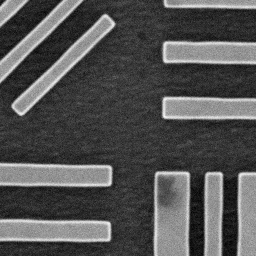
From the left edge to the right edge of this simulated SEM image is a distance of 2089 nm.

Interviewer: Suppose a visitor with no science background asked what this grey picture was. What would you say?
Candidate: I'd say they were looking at groups of lines, slits or small figures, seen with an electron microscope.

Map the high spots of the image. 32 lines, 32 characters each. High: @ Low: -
@@@----@@@-----------@@@@@@@@@@@
@@----@@@-----------------------
@----@@@----@@------------------
----@@@----@@@------------------
---@@@----@@@-------------------
--@@@----@@@---------@@@@@@@@@@@
-@@@----@@@---------@@@@@@@@@@@@
@@@----@@@-----------@@@@@@@@@@@
@@----@@@-----------------------
@----@@@------------------------
----@@@-------------------------
---@@@--------------------------
--@@@---------------@@@@@@@@@@@@
--@@----------------@@@@@@@@@@@@
--------------------@@@@@@@@@@@@
--------------------------------
--------------------------------
--------------------------------
--------------------------------
--------------------------------
--------------------------------
@@@@@@@@@@@@@@------------------
@@@@@@@@@@@@@@-----@@@@@--@@--@@
-------------------@@@@@--@@--@@
-------------------@@@@@--@@--@@
-------------------@@@@@--@@--@@
-------------------@@@@@--@@--@@
-------------------@@@@@--@@--@@
@@@@@@@@@@@@@@-----@@@@@--@@--@@
@@@@@@@@@@@@@@-----@@@@@--@@--@@
-------------------@@@@@--@@--@@
-------------------@@@@@--@@--@@